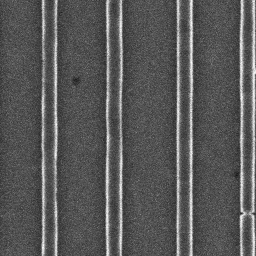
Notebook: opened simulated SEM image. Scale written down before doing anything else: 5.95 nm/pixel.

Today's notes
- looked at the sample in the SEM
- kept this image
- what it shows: one or a few lines or trenches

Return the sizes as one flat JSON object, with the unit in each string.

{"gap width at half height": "306 nanometers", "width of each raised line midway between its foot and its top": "81.1 nm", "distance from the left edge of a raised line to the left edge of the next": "393 nanometers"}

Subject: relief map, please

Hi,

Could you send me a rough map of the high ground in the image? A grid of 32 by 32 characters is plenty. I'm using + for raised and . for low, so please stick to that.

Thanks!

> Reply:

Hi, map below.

.....++......++.......++......++
.....++......++.......++......++
.....++.......+.......++......++
.....++.......+.......++......++
.....++.......+.......++......++
.....++.......+.......++......++
.....++.......+.......++......++
.....++.......+.......++......++
.....++.......+.......++......++
.....++......++.......++......++
.....++......++.......++......++
.....++......++.......++......++
.....++......++.......++......++
.....++......++.......++......++
.....++......++.......++......++
.....++......++.......++......++
.....++......++.......++......++
.....++......++.......++......++
.....++......++.......++......++
.....++......++.......++......++
.....++......++.......++......++
.....++......++.......++......++
.....++......++.......++......++
.....++......++.......++......++
.....++......++.......++......++
.....++......++.......++......++
.....++......++.......++......++
.....++......++.......++......++
.....++......++.......++......++
.....++......++.......++......++
.....++......++.......++......++
.....++......++.......++......++